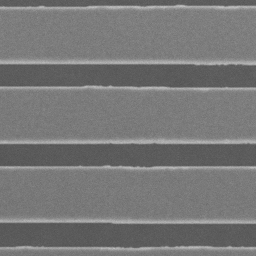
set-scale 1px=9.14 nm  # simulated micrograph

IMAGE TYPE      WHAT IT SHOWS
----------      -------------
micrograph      lines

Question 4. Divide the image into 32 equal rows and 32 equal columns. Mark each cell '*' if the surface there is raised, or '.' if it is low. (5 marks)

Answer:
................................
********************************
********************************
********************************
********************************
********************************
********************************
********************************
................................
................................
................................
********************************
********************************
********************************
********************************
********************************
********************************
********************************
................................
................................
................................
********************************
********************************
********************************
********************************
********************************
********************************
********************************
................................
................................
................................
********************************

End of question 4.